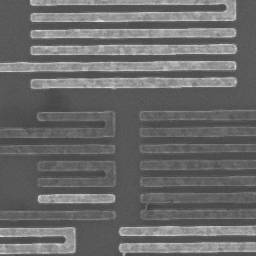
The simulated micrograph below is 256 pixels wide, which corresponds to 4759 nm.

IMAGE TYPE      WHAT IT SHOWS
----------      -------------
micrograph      wiring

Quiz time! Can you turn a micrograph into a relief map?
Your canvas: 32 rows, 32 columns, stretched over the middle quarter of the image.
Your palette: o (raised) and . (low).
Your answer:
oooooooooooooooooooooooooooooooo
ooooooooooooooooooooooooo.......
................................
................................
oooooooooooooooooooooooooooooooo
oooooooooooooooooooooooooooooooo
................................
................................
................................
................................
................................
................................
ooooooooooooo......ooooooooooooo
ooooooooooooo......ooooooooooooo
..........ooo...................
..........ooo...................
ooooooooooooo......ooooooooooooo
ooooooooooooo......ooooooooooooo
................................
................................
oooooooooooo.......ooooooooooooo
ooooooooooooo......ooooooooooooo
................................
................................
oooooooooooo........oooooooooooo
ooooooooooooo......ooooooooooooo
ooooooooooooo...................
..........ooo...................
..........ooo.......oooooooooooo
ooooooooooooo......ooooooooooooo
oooooooooooo........oooooo......
................................